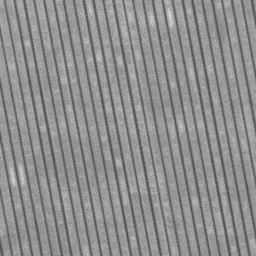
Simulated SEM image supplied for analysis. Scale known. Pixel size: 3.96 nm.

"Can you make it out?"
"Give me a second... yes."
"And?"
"parallel lines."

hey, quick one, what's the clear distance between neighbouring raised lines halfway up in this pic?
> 2.83 px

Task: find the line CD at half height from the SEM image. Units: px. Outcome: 6.64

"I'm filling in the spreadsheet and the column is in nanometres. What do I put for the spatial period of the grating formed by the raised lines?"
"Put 38.5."